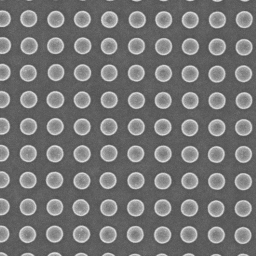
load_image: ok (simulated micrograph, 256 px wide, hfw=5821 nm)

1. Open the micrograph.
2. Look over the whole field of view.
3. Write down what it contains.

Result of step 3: a regular array of raised bodies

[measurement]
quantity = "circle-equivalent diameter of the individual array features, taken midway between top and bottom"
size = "368 nm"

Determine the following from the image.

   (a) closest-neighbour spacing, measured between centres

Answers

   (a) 0.605 µm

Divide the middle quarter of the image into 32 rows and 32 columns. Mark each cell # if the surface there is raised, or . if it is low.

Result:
....##....##.....##.....##......
...###....###...####...####...##
...###....###...####...####...##
...###....###....###...####...##
................................
................................
................................
...###....###....##....###....##
...###...####...####...####...##
...###...####...####...####...##
...###....##.....##....###....##
................................
................................
................................
...###....###....###...###....##
...###...####...####...####..###
...###...####...####...####..###
....#.....##.....##.....#.....##
................................
................................
...........#............#.......
...###...####...####...####...##
...###...####...####...####...##
...###....###...###....###....##
................................
................................
................................
....#.....##.....##.....##.....#
...###...####...####...####...##
...###...####...####...####...##
...###....##.....##....###....##
................................